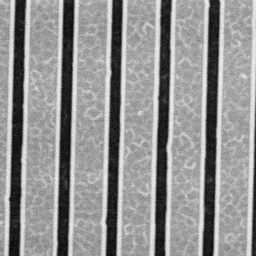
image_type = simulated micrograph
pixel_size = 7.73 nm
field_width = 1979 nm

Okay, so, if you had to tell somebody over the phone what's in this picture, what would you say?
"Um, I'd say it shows parallel lines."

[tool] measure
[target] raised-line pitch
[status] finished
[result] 375 nm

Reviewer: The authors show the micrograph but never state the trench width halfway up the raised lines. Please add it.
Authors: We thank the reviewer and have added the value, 0.116 µm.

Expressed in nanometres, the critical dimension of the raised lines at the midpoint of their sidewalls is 257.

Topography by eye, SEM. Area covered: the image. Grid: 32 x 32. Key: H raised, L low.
HHLLHHHHLLHHHHLLHHHHLLHHHHLLHHHH
HHLLHHHHLLHHHHLLHHHHLLHHHHLLHHHH
HHLLHHHHLLHHHHLLHHHHLLHHHHLLHHHH
HLLHHHHHLLHHHHLLHHHHLLHHHHLLHHHH
HLLHHHHHLHHHHHLLHHHHLLHHHHLLHHHH
HLLHHHHLLHHHHHLLHHHHLLHHHHLLHHHH
HLLHHHHLLHHHHLLLHHHHLLHHHHLLHHHH
HLLHHHHLLHHHHLLLHHHHLLHHHHLLHHHH
HLLHHHHLLHHHHHLLHHHHLLHHHHLLHHHH
HLLHHHHLLHHHHHLHHHHHLLHHHHLLHHHH
HLLHHHHLLHHHHLLHHHHHLLHHHHLLHHHH
HLLHHHHLLHHHHLLHHHHHLHHHHHLLHHHH
HLLHHHHLLHHHHLLHHHHLLHHHHHLHHHHH
HLLHHHHLLHHHHLLHHHHLLHHHHLLHHHHH
HLLHHHHLLHHHHLLHHHHLLHHHHLLHHHHL
HLLHHHHLLHHHHLLHHHHLLHHHHLLHHHHL
HLLHHHHLLHHHHLLHHHHLLHHHHLLHHHHL
HLLHHHHLLHHHHLLHHHHLLHHHHLLHHHHL
HLLHHHHLLHHHHLLHHHHLLHHHHLLHHHHL
HLLHHHHLLHHHHLLHHHHLLHHHHLLHHHHL
HLLHHHHLLHHHHLLHHHHLLHHHHLLHHHHL
HLLHHHHLLHHHHLLHHHHLLHHHHLLHHHHL
HLLHHHHLLHHHHLLHHHHLLHHHHLLHHHHL
HLLHHHHLLHHHHLLHHHHLLHHHHLLHHHHL
HLLHHHHLLHHHHLLHHHHLLHHHHLLHHHHL
HLLHHHHLLHHHHLLHHHHLLHHHHLLHHHHL
HLLHHHHLLHHHHLLHHHHLLHHHHLLHHHHL
HLLHHHHLLHHHHLLHHHHLLHHHHLLHHHHL
HLLHHHHLLHHHHLLHHHHLLHHHHLLHHHHL
HLLHHHHLLHHHHLLHHHHLLHHHHLLHHHHL
HLLHHHHLLHHHHLLHHHHLLHHHHLLHHHHL
HLLHHHHLLHHHHLLHHHHLLHHHHLLHHHHL